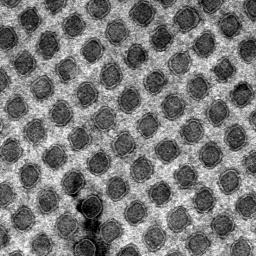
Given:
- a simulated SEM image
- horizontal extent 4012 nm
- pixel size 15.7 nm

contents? a regular array of raised bodies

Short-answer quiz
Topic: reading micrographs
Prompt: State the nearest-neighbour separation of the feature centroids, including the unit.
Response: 483 nm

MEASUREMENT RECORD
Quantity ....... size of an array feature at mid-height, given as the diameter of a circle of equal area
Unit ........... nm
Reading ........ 329